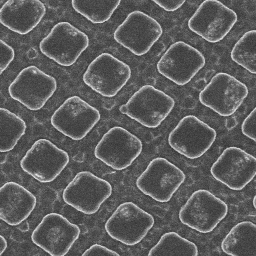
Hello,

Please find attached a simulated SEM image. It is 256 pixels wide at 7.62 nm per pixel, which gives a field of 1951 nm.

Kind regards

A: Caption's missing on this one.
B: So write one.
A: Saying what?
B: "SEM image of a regular array of raised bodies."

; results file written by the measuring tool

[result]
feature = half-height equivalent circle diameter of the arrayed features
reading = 316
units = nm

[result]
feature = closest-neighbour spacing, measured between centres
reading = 400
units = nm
